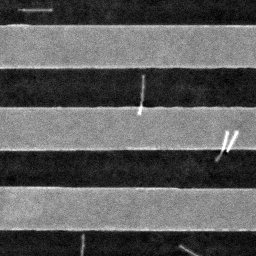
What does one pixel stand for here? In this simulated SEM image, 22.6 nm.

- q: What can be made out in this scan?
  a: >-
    lines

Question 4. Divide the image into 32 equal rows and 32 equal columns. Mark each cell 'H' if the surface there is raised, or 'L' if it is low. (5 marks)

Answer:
LLLLLLLLLLLLLLLLLLLLLLLLLLLLLLLL
LLLLLLLLLLLLLLLLLLLLLLLLLLLLLLLL
LLLLLLLLLLLLLLLLLLLLLLLLLLLLLLLL
HHHHHHHHHHHHHHHHHHHHHHHHHHHHHHHH
HHHHHHHHHHHHHHHHHHHHHHHHHHHHHHHH
HHHHHHHHHHHHHHHHHHHHHHHHHHHHHHHH
HHHHHHHHHHHHHHHHHHHHHHHHHHHHHHHH
HHHHHHHHHHHHHHHHHHHHHHHHHHHHHHHH
LLLLLLLLLLLLLLLLLLLLLLLLLLLLLLLL
LLLLLLLLLLLLLLLLLLLLLLLLLLLLLLLL
LLLLLLLLLLLLLLLLLLLLLLLLLLLLLLLL
LLLLLLLLLLLLLLLLLLLLLLLLLLLLLLLL
LLLLLLLLLLLLLLLLLLLLLLLLLLLLLLLL
LLLLLLLLLLLLHHLHHHLHHLHLLHHHLHLL
HHHHHHHHHHHHHHHHHHHHHHHHHHHHHHHH
HHHHHHHHHHHHHHHHHHHHHHHHHHHHHHHH
HHHHHHHHHHHHHHHHHHHHHHHHHHHHHHHH
HHHHHHHHHHHHHHHHHHHHHHHHHHHHHHHH
HHHHHHHHHHHHHHHHHHHHHHHHHHHHHHHH
LLLLLLLLLLLLLLLLLLLLLLLLLLLLLLLL
LLLLLLLLLLLLLLLLLLLLLLLLLLLLLLLL
LLLLLLLLLLLLLLLLLLLLLLLLLLLLLLLL
LLLLLLLLLLLLLLLLLLLLLLLLLLLLLLLL
HHHHHHHHLLLLLLLLLLLLLLLLLLLLLLLL
HHHHHHHHHHHHHHHHHHHHHHHHHHHHHHHH
HHHHHHHHHHHHHHHHHHHHHHHHHHHHHHHH
HHHHHHHHHHHHHHHHHHHHHHHHHHHHHHHH
HHHHHHHHHHHHHHHHHHHHHHHHHHHHHHHH
HHHHHHHHHHHHHHHHHHHHHHHHHHHHHHHH
LLLLLLLLLLLLLLLLLLLLLLLLLLLLLLLL
LLLLLLLLLLLLLLLLLLLLLLLLLLLLLLLL
LLLLLLLLLLLLLLLLLLLLLLLLLLLLLLLL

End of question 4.